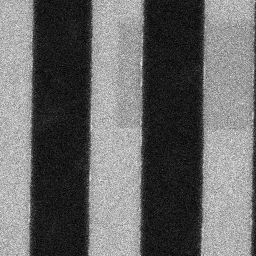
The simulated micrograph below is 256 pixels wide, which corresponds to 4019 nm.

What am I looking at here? one or a few lines or trenches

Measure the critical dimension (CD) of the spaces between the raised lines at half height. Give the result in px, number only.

48.9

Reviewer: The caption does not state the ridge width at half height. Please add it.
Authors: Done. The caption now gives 965 nm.